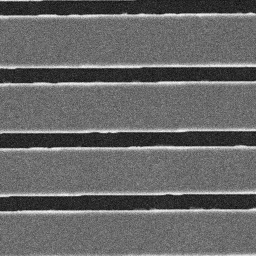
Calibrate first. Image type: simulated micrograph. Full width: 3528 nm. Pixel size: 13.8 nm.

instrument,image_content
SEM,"lines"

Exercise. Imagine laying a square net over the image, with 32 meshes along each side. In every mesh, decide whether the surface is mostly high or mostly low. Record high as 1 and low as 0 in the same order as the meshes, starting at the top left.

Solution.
00000000000000000000000000000000
00000000000000000000000000000000
11111111111111111111111111111111
11111111111111111111111111111111
11111111111111111111111111111111
11111111111111111111111111111111
11111111111111111111111111111111
11111111111111111111111111111111
01000000000000000000000000000000
00000000000000000000000000000000
00001100111111111111111111111111
11111111111111111111111111111111
11111111111111111111111111111111
11111111111111111111111111111111
11111111111111111111111111111111
11111111111111111111111111111111
11111111111111100000000000000000
00000000000000000000000000000000
00000000000000000111111111111111
11111111111111111111111111111111
11111111111111111111111111111111
11111111111111111111111111111111
11111111111111111111111111111111
11111111111111111111111111111111
10000000000000000000000000000000
00000000000000000000000000000000
00011111111111111111111111111111
11111111111111111111111111111111
11111111111111111111111111111111
11111111111111111111111111111111
11111111111111111111111111111111
11111111111111111111111111111111